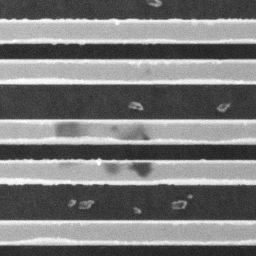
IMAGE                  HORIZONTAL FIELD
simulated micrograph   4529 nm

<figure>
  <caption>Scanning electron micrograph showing lines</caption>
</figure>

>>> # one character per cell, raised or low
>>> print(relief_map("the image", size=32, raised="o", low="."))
................................
................................
......o.......o.oo..............
oooooooooooooooooooooooooooooooo
oooooooooooooooooooooooooooooooo
................................
................................
oooooooooooooooooooooooooooooooo
oooooooooooooooooooooooooooooooo
oooooooooooooooooooooooooooooooo
................................
................................
................................
................................
................................
oooooooooooooooooooooooooooooooo
oooooooooooooooooooooooooooooooo
oooooooooooooooooooooooooooooooo
................................
................................
oooooooooooooooooooooooooooooooo
oooooooooooooooooooooooooooooooo
oooooooooooooooooooooooooooooooo
................................
................................
................................
................................
................................
oooooooooooooooooooooooooooooooo
oooooooooooooooooooooooooooooooo
................................
................................